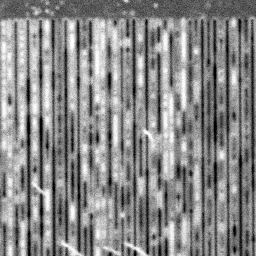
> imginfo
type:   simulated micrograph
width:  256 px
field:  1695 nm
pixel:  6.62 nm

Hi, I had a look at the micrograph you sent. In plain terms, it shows parallel lines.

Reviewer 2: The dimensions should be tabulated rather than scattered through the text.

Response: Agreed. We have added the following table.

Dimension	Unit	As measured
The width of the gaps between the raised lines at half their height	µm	0.0066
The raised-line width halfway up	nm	32.3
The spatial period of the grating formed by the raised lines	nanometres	41.2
